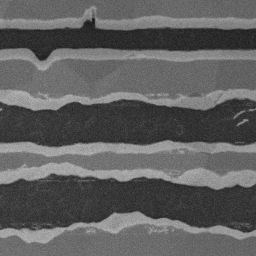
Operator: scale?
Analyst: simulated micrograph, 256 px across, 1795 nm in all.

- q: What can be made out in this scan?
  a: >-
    one or a few lines or trenches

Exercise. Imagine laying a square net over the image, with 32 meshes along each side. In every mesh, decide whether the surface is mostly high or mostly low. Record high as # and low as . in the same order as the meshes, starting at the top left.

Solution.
################################
################################
##########..####################
................................
................................
................................
................................
####..##########################
################################
################################
################################
################################
...#####..###......#.######.....
................................
................................
................................
................................
................................
##..........##.....#######.##..#
################################
################################
###.......#..###################
..........................##....
................................
................................
................................
................................
.................#..............
........###############.........
###...#########################.
################################
################################